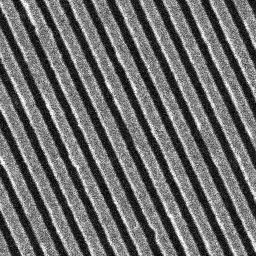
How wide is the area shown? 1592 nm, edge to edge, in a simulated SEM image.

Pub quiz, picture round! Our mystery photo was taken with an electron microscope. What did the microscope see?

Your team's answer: parallel lines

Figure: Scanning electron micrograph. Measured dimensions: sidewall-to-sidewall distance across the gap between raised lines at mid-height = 55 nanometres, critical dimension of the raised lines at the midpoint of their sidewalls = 0.0769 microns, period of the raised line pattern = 133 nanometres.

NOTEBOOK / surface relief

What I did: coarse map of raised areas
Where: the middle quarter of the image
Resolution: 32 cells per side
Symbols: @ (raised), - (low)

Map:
---@@@---@@@---@@@---@@@--@@@@--
@--@@@@--@@@---@@@---@@@---@@@--
@---@@@---@@@---@@@---@@@--@@@@-
@@--@@@@--@@@---@@@---@@@---@@@-
@@---@@@--@@@@---@@@--@@@@--@@@@
@@---@@@---@@@---@@@---@@@---@@@
@@@---@@@--@@@@--@@@@--@@@@--@@@
@@@---@@@---@@@---@@@---@@@---@@
-@@@---@@@--@@@@--@@@@--@@@@--@@
-@@@@--@@@---@@@---@@@---@@@---@
--@@@---@@@--@@@@--@@@@--@@@@--@
--@@@---@@@---@@@---@@@---@@@---
---@@@---@@@--@@@@--@@@---@@@---
---@@@---@@@---@@@---@@@---@@@--
@--@@@@--@@@@--@@@---@@@---@@@--
@---@@@---@@@---@@@--@@@@--@@@@-
@@--@@@@--@@@---@@@---@@@---@@@-
@@---@@@---@@@---@@@--@@@@--@@@@
@@@--@@@---@@@@--@@@---@@@---@@@
@@@---@@@---@@@---@@@--@@@@--@@@
@@@@--@@@@--@@@---@@@---@@@---@@
-@@@---@@@---@@@--@@@@--@@@@--@@
-@@@@--@@@@--@@@---@@@---@@@---@
-@@@@--@@@@---@@@--@@@@--@@@@--@
--@@@---@@@@--@@@---@@@---@@@---
---@@@--@@@@--@@@@--@@@@--@@@@--
@--@@@---@@@---@@@---@@@---@@@--
@---@@@---@@@--@@@@--@@@@--@@@--
@---@@@---@@@---@@@---@@@--@@@@-
@@---@@@--@@@@--@@@---@@@---@@@-
@@---@@@---@@@---@@@---@@@--@@@@
@@@--@@@@--@@@@--@@@@--@@@---@@@